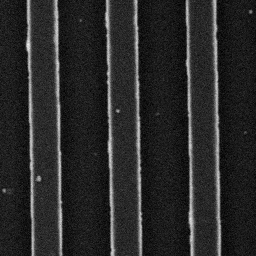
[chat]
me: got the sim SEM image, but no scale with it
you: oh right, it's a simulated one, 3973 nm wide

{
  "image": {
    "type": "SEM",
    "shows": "lines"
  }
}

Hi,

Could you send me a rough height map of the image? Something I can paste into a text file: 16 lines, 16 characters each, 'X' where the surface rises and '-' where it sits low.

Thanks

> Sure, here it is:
--XX---XX---X---
--XX---XX---X---
--XX---XX---XX--
--XX---XX---XX--
--XX---XX---XX--
--XX---XX---XX--
--XX---XX---XX--
--XX---XX---XX--
--XX---XX---XX--
--XX---XX---XX--
--XX---XX---XX--
--XX---XX---XX--
--XX---XX---XX--
--XX---XX---XX--
--XX---XX---XX--
--XX---XX---XX--